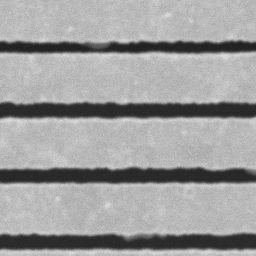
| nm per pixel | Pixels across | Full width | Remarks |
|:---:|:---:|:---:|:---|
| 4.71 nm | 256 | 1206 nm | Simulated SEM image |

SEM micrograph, lines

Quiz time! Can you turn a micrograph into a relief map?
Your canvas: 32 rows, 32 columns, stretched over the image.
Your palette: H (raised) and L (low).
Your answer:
HHHHHHHHHHHHHHHHHHHHHHHHHHHHHHHH
HHHHHHHHHHHHHHHHHHHHHHHHHHHHHHHH
HHHHHHHHHHHHHHHHHHHHHHHHHHHHHHHH
HHHHHHHHHHHHHHHHHHHHHHHHHHHHHHHH
HHHHHHHHHHHHHHHHHHHHHHHHHHHHHHHH
LLLLLLLLLLLLLLLLLLLLLLLLLLLLLLLL
LLLLLLLLLLLLLLLLLLLLLLLLLLLLLLLL
HHHHHHHHHHHHHHHHHHHHHHHHHHHHHHHH
HHHHHHHHHHHHHHHHHHHHHHHHHHHHHHHH
HHHHHHHHHHHHHHHHHHHHHHHHHHHHHHHH
HHHHHHHHHHHHHHHHHHHHHHHHHHHHHHHH
HHHHHHHHHHHHHHHHHHHHHHHHHHHHHHHH
HHHHHHHHHHHHHHHHHHHHHHHHHHHHHHHH
LLLLLLLLLLLLLLLLLLLLLLLLLLLLLLLL
LLLLLLLLLLLLLLLLLLLLLLLLLLLLLLLL
HHHHHHHHHHHHHHHHHHHHHHHHHHHHHHHH
HHHHHHHHHHHHHHHHHHHHHHHHHHHHHHHH
HHHHHHHHHHHHHHHHHHHHHHHHHHHHHHHH
HHHHHHHHHHHHHHHHHHHHHHHHHHHHHHHH
HHHHHHHHHHHHHHHHHHHHHHHHHHHHHHHH
HHHHHHHHHHHHHHHHHHHHHHHHHHHHHHHH
LLLLLLLLLLLLLLLLLLLLLLLLLLLLLLLL
LLLLLLLLLLLLLLLLLLLLLLLLLLLLLLLL
HHHHHHHHHHHHHHHHHHHHHHHHHHHHHHHH
HHHHHHHHHHHHHHHHHHHHHHHHHHHHHHHH
HHHHHHHHHHHHHHHHHHHHHHHHHHHHHHHH
HHHHHHHHHHHHHHHHHHHHHHHHHHHHHHHH
HHHHHHHHHHHHHHHHHHHHHHHHHHHHHHHH
HHHHHHHHHHHHHHHHHHHHHHHHHHHHHHHH
LLLLLLLLLLLLLLLLLLLLLLLLLLLLLLLL
LLLLLLLLLLLLLLLLLLLLLLLLLLLLLLLL
HHHHHHHHHHHHHHHHHHHHHHHHHHHHHHHH